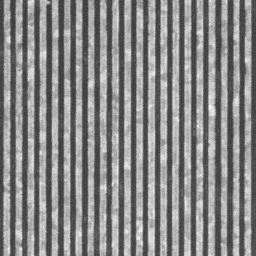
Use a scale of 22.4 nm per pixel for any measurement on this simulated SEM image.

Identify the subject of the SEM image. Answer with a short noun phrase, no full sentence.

parallel lines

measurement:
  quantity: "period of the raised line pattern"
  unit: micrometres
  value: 0.27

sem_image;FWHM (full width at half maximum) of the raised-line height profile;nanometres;123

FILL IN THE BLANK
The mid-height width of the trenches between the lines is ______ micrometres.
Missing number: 0.145